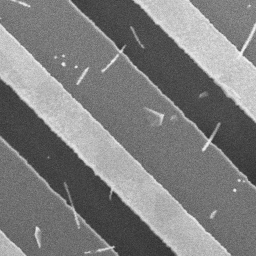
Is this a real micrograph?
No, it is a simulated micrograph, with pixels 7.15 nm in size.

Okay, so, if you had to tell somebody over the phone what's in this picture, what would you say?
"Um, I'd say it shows lines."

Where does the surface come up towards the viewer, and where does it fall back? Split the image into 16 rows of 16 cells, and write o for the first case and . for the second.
ooooo....ooooooo
oooooo....oooooo
ooooooo....ooooo
oooooooo....oooo
ooooooooo....ooo
.ooooooooo....oo
..ooooooooo....o
...ooooooooo....
....ooooooooo...
o....ooooooooo..
oo....ooooooooo.
ooo....ooooooooo
oooo....oooooooo
ooooo....ooooooo
oooooo....oooooo
ooooooo....ooooo